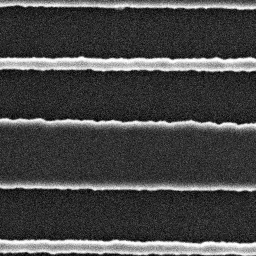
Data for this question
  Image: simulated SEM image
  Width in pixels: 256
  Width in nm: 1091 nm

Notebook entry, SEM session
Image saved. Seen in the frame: lines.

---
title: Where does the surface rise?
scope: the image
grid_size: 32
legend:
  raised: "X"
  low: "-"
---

XXXXXXXXXXXXXXXXXXXXXXXXXXXXXXXX
--------------------------------
--------------------------------
--------------------------------
--------------------------------
--------------------------------
--------------------------------
XXXXXXXXXXXXXXXXXXXXX-XXXXXX-XXX
XXXXXXXXXXXXXXXXXXXXXXXXXXXXXXXX
--------------------------------
--------------------------------
--------------------------------
--------------------------------
--------------------------------
--------------------------------
XXXXXXXXXXXXXXXXXXXXXXXXXXX-X---
XXXXXXXXXXXXXXXXXXXXXXXXXXXXXXXX
XXXXXXXXXXXXXXXXXXXXXXXXXXXXXXXX
XXXXXXXXXXXXXXXXXXXXXXXXXXXXXXXX
XXXXXXXXXXXXXXXXXXXXXXXXXXXXXXXX
XXXXXXXXXXXXXXXXXXXXXXXXXXXXXXXX
XXXXXXXXXXXXXXXXXXXXXXXXXXXXXXXX
XXXXXXXXXXXXXXXXXXXXXXXXXXXXXXXX
-------XXX-XXXXXXXXXXXXXXXXXXXXX
--------------------------------
--------------------------------
--------------------------------
--------------------------------
--------------------------------
--------------------------------
XXXXXXXXXXXXXXXXXXXXXXXX-XXXXX-X
X--XX-XXX-XXXXXXXXXXXXXXXXXXXXXX